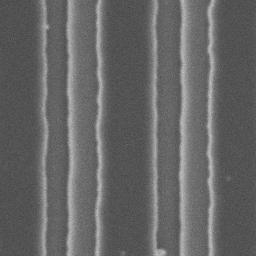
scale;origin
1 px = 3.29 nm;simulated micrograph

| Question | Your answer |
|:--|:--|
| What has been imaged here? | lines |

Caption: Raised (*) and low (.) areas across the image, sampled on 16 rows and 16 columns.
***...****...***
***...****...***
***...****...***
***...****...***
***...****...***
***...****...***
***...****...***
***...****...***
***...****...***
***...****...***
***...****...***
***...****...***
***...****...***
***...****...***
***...****...***
***...****...***